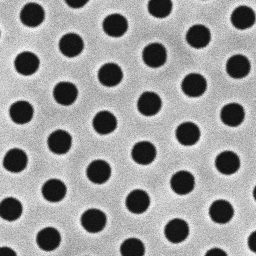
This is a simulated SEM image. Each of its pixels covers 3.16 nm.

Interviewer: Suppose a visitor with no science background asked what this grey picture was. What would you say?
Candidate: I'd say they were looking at a regular array of holes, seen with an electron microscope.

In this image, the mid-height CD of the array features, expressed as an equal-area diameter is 77.3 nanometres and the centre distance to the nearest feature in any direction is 152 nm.